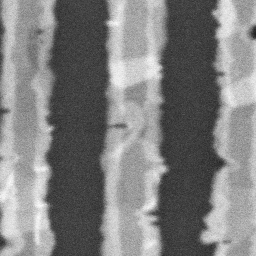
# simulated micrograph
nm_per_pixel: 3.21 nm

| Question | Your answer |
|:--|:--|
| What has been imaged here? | one or a few lines or trenches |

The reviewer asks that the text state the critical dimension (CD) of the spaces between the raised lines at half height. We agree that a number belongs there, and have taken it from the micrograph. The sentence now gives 234 nanometers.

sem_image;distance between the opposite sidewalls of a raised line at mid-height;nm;113